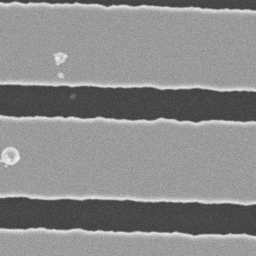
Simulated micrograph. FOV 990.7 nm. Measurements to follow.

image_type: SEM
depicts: lines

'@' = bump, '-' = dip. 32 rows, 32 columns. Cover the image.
@@@@@@@@@@----------------------
@@@@@@@@@@@@@@@@@@@@@@@@@@@@@@@@
@@@@@@@@@@@@@@@@@@@@@@@@@@@@@@@@
@@@@@@@@@@@@@@@@@@@@@@@@@@@@@@@@
@@@@@@@@@@@@@@@@@@@@@@@@@@@@@@@@
@@@@@@@@@@@@@@@@@@@@@@@@@@@@@@@@
@@@@@@@@@@@@@@@@@@@@@@@@@@@@@@@@
@@@@@@@@@@@@@@@@@@@@@@@@@@@@@@@@
@@@@@@@@@@@@@@@@@@@@@@@@@@@@@@@@
@@@@@@@@@@@@@@@@@@@@@@@@@@@@@@@@
@@@@@@@@@@@@@@@@@@@@@@@@@@@@@@@@
--------------------------------
--------------------------------
--------------------------------
--------------------------------
@@@@@@@@@@@@@@@@@@@@@@@@@@@@@@@@
@@@@@@@@@@@@@@@@@@@@@@@@@@@@@@@@
@@@@@@@@@@@@@@@@@@@@@@@@@@@@@@@@
@@@@@@@@@@@@@@@@@@@@@@@@@@@@@@@@
@@@@@@@@@@@@@@@@@@@@@@@@@@@@@@@@
@@@@@@@@@@@@@@@@@@@@@@@@@@@@@@@@
@@@@@@@@@@@@@@@@@@@@@@@@@@@@@@@@
@@@@@@@@@@@@@@@@@@@@@@@@@@@@@@@@
@@@@@@@@@@@@@@@@@@@@@@@@@@@@@@@@
@@@@@@@@@@@@@@@@@@@@@@@@@@@@@@@@
------------------------------@@
--------------------------------
--------------------------------
-----@--------------------------
@@@@@@@@@@@@@@@@@@@@@@@@@@@@@@@@
@@@@@@@@@@@@@@@@@@@@@@@@@@@@@@@@
@@@@@@@@@@@@@@@@@@@@@@@@@@@@@@@@